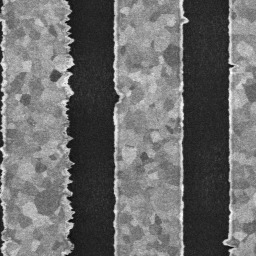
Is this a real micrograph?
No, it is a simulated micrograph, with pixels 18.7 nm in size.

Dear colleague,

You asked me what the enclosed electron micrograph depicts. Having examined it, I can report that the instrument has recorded one or a few lines or trenches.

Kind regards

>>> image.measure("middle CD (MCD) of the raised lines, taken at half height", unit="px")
66.3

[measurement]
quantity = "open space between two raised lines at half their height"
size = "889 nm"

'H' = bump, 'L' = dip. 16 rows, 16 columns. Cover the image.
HHHHLLLHHHHLLLHH
HHHHLLLHHHHLLLHH
HHHHLLLHHHHLLLHH
HHHHLLLHHHHLLLHH
HHHHLLLHHHHLLLHH
HHHHLLLHHHHLLLHH
HHHHLLLHHHHLLLHH
HHHHLLLHHHHLLLHH
HHHHLLLHHHHLLLHH
HHHHLLLHHHHLLLHH
HHHHLLLHHHHLLLHH
HHHHLLLHHHHLLLHH
HHHHLLLHHHHLLLHH
HHHHLLLHHHHLLLHH
HHHHLLLHHHHLLLHH
HHHHLLLHHHHLLLHH